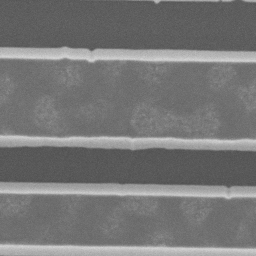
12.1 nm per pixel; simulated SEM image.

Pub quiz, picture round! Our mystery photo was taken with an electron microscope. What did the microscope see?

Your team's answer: one or a few lines or trenches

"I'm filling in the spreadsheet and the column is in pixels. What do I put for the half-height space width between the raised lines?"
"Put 47.2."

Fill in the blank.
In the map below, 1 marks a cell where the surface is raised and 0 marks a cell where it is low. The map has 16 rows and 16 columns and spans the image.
0000000000000000
0000000000000000
0000000000000000
1111111111000000
1111111111111111
1111111111111111
1111111111111111
1111111111111111
1111111111111111
0000000000000000
0000000000000000
0000000000000000
1111111111111111
1111111111111111
1111111111111111
1111111111111111